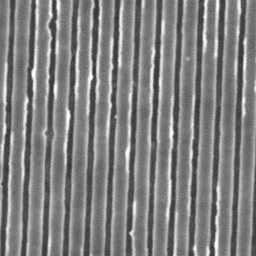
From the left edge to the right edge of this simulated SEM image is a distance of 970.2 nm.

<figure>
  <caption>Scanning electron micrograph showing parallel lines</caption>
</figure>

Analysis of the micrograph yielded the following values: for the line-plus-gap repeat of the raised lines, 79.4 nm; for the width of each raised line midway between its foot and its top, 57.8 nm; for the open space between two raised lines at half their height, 21.8 nanometres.